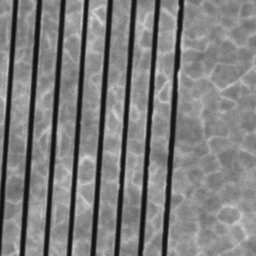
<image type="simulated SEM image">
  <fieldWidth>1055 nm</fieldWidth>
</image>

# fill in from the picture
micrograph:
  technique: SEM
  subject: parallel lines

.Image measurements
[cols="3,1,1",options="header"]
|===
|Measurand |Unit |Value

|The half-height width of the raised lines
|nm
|75.1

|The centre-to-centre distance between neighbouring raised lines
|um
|0.0973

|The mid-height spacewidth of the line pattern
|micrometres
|0.0211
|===